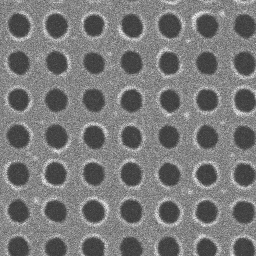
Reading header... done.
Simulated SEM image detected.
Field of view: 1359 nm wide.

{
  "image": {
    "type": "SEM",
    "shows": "a regular array of holes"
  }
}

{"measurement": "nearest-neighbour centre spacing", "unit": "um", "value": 0.196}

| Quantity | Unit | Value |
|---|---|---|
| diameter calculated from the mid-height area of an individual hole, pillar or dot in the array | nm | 122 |